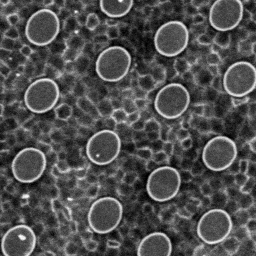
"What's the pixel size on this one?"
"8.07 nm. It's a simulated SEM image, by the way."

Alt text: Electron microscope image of a regular array of raised bodies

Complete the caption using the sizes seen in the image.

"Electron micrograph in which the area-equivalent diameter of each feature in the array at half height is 269 nm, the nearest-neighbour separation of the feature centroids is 534 nm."